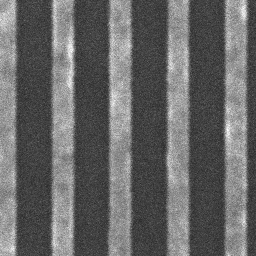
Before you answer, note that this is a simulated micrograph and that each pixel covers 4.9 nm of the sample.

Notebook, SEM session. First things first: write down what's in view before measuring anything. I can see parallel lines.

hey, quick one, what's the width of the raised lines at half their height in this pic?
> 0.0961 um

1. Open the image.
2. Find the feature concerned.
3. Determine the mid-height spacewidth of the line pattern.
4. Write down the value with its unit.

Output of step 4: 188 nm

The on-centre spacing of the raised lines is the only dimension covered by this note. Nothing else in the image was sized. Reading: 282 nm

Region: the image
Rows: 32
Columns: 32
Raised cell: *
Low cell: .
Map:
**.....**.....**.....**.....***.
**.....**.....**.....**.....***.
**.....**.....**.....**.....***.
**.....**.....**.....**.....***.
**.....**.....**.....**.....***.
**.....**.....**.....**.....***.
**.....**.....**.....**.....***.
**.....**.....**.....**.....***.
**.....**.....**.....**.....***.
**.....**.....**.....**.....***.
**.....**.....**.....**.....***.
**.....**.....**.....**.....***.
**.....**.....**.....**.....***.
**.....**.....**.....**.....***.
**.....**.....**.....**.....***.
**.....**.....**.....**.....***.
**.....**.....**.....**.....***.
**.....**.....**.....**.....***.
**.....**.....**.....**.....***.
**.....**.....**.....**.....***.
**.....**.....**.....**.....***.
**.....**.....**.....**.....***.
**.....**.....**.....**.....***.
**.....**.....**.....**.....***.
**.....**.....**.....**.....***.
**.....**.....**.....**.....***.
**.....**.....**.....**.....***.
**.....**.....**.....**.....***.
**.....**.....**.....**.....***.
**.....**.....**.....**.....***.
**.....**.....**.....**.....***.
**.....**.....**.....**.....***.